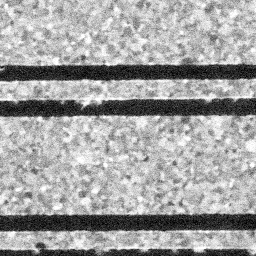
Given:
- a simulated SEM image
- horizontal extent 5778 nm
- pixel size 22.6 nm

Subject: lines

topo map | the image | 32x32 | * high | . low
********************************
********************************
********************************
********************************
********************************
********************************
********************************
********************************
................................
................................
********************************
********************************
***.......**....................
................................
..........................******
********************************
********************************
********************************
********************************
********************************
********************************
********************************
********************************
********************************
********************************
********************************
********************************
................................
................................
********************************
********************************
................................